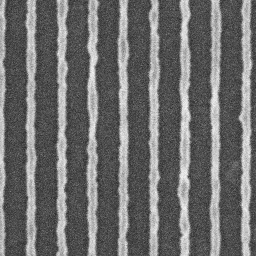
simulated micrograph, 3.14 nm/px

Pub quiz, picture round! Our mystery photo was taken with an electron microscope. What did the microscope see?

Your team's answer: parallel lines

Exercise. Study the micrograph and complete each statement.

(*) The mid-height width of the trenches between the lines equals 74.9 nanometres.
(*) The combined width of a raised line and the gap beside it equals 96.4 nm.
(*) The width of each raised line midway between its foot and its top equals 21.2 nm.